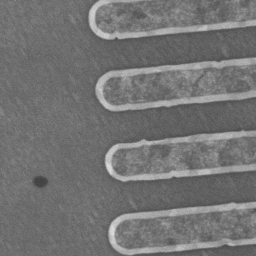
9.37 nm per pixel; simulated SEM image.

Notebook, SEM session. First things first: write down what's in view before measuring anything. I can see one or a few lines or trenches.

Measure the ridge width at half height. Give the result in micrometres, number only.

0.322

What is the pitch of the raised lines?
72.1 px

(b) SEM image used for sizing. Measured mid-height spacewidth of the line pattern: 37.7 px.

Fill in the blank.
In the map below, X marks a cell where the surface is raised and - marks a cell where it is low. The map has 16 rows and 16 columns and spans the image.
------XXXXXXXXXX
------XXXXXXXXX-
----------------
----------------
--------XXXXXXXX
------XXXXXXXXXX
-------XXX------
----------------
--------------XX
-------XXXXXXXXX
-------XXXXXXXX-
----------------
----------------
--------XXXXXXXX
-------XXXXXXXXX
--------XXX-----